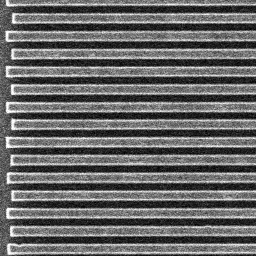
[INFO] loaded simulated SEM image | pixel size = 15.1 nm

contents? parallel lines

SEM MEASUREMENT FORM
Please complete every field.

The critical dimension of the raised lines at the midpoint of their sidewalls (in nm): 145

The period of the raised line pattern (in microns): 0.267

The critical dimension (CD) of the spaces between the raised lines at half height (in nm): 130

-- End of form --